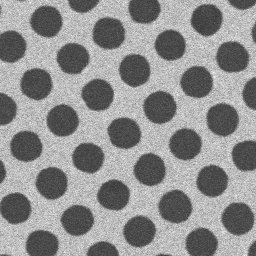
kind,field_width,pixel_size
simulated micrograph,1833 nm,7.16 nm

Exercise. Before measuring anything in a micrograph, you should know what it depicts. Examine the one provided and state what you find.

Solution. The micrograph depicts a regular array of holes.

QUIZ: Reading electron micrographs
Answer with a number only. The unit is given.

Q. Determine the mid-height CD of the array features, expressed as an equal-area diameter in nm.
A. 231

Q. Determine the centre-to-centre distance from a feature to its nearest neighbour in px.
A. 43.9